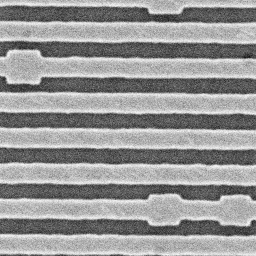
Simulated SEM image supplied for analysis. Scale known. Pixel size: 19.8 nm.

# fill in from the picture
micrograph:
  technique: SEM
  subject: wiring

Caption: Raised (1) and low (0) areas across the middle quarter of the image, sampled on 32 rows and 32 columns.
11111111111111111111111111111111
11111111111111111111111111111111
11111111111111111111111111111111
00000000000000000000000000000000
00000000000000000000000000000000
00000000000000000000000000000000
00000000000000000000000000000000
11111111111111111111111111111110
11111111111111111111111111111111
11111111111111111111111111111111
11111111111111111111111111111111
11111111111111111111111111111111
00000000000000000000000000000000
00000000000000000000000000000000
00000000000000000000000000000000
00000000000000000000000000000000
11111111111000111111111000000000
11111111111111111111111111111111
11111111111111111111111111111111
11111111111111111111111111111111
11111111111111111111111111111111
00000000000000000000000000000000
00000000000000000000000000000000
00000000000000000000000000000000
00000000000000000000000000000000
11111111111111111111111111111111
11111111111111111111111111111111
11111111111111111111111111111111
11111111111111111111111111111111
11111111111111111111111111111111
00000000000000000000000000000000
00000000000000000000000000000000